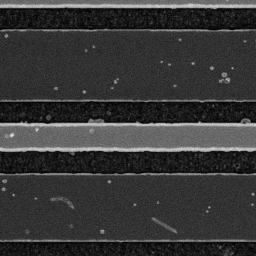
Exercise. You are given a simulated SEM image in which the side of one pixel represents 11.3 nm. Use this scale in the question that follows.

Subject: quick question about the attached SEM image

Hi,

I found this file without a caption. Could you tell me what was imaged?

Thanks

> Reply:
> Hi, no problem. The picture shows lines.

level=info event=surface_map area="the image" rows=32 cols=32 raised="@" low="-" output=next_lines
@@@@@@@@@@@@@@@@@@@@@@@@@@@@@@@@
--------------------------------
--------------------------------
--------------------------------
@@@@@@@@@@@@@@@@@@@@@@@@@@@@@@@@
@@@@@@@@@@@@@@@@@@@@@@@@@@@@@@@@
@@@@@@@@@@@@@@@@@@@@@@@@@@@@@@@@
@@@@@@@@@@@@@@@@@@@@@@@@@@@@@@@@
@@@@@@@@@@@@@@@@@@@@@@@@@@@@@@@@
@@@@@@@@@@@@@@@@@@@@@@@@@@@@@@@@
@@@@@@@@@@@@@@@@@@@@@@@@@@@@@@@@
@@@@@@@@@@@@@@@@@@@@@@@@@@@@@@@@
@@@@@@@@@@@@@@@@@@@@@@@@@@@@@@@@
--------------------------------
--------------------------------
@@@@@@-@@@@@@@@@@@-@@-@@@@@@-@-@
@@@@@@@@@@@@@@@@@@@@@@@@@@@@@@@@
@@@@@@@@@@@@@@@@@@@@@@@@@@@@@@@@
@@@@@@@@@@@@@@@@@@@@@@@@@@@@@@@@
--------------------------------
--------------------------------
--------------------------------
@@@@@@@@@@@@@@@@@@@@@@@@@@@@@@@@
@@@@@@@@@@@@@@@@@@@@@@@@@@@@@@@@
@@@@@@@@@@@@@@@@@@@@@@@@@@@@@@@@
@@@@@@@@@@@@@@@@@@@@@@@@@@@@@@@@
@@@@@@@@@@@@@@@@@@@@@@@@@@@@@@@@
@@@@@@@@@@@@@@@@@@@@@@@@@@@@@@@@
@@@@@@@@@@@@@@@@@@@@@@@@@@@@@@@@
@@@@@@@@@@@@@@@@@@@@@@@@@@@@@@@@
--------------------------------
--------------------------------